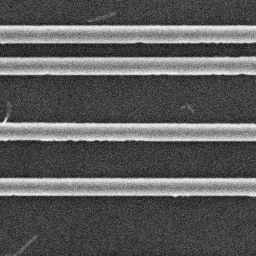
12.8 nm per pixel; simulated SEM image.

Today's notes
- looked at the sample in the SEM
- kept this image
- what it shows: lines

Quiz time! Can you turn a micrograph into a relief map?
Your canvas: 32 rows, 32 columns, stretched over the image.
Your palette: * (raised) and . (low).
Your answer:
................................
................................
................................
********************************
********************************
................................
................................
********************************
********************************
................................
................................
................................
................................
................................
................................
*...............................
********************************
**...***************************
................................
................................
................................
................................
********************************
********************************
................................
................................
................................
................................
................................
................................
................................
................................